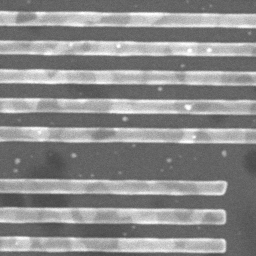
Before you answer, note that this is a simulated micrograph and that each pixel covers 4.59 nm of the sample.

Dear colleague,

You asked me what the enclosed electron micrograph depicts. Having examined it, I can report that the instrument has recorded wiring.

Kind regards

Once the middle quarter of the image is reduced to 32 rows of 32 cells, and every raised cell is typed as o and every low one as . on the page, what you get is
................................
................................
oooooooooooooooooooooooooooooooo
oooooooooooooooooooooooooooooooo
oooooooooooooooooooooooooooooooo
................................
................................
................................
................................
oooooooooooo....oooooooooooooooo
ooooooooooo..ooo..oooooooooooooo
ooooooooooo.oooooooooooooooooooo
................................
...............o................
................................
................................
oooooooooooooooooooooooooooooooo
oooooooooooo.ooooooooooooooooooo
oooooooooooooooooooooooooooooooo
..........................oooooo
................................
................................
................................
................................
................................
................................
................................
................................
................................
oooooooooooooooooooooooooooooooo
oooooooooooooooooooo..oooooooooo
oooooooooooooooooooooooooooooooo